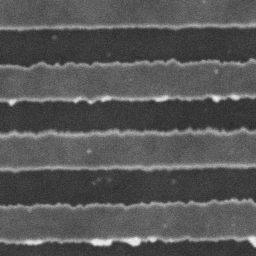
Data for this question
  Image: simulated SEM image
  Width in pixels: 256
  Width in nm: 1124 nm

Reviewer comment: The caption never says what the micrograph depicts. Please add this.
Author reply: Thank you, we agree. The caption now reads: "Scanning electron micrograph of lines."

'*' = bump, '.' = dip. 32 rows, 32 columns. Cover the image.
********************************
********************************
********************************
*******....*....................
................................
................................
................................
...............................*
********************************
********************************
********************************
********************************
*******.******..*..**......*....
................................
................................
................................
.......................*..*...*.
********************************
********************************
********************************
********************************
................................
................................
................................
................................
.................*.*************
********************************
********************************
********************************
********************************
...**......***..*...............
................................